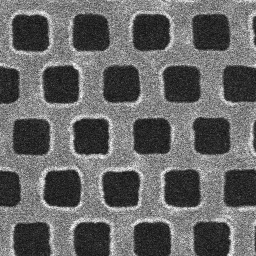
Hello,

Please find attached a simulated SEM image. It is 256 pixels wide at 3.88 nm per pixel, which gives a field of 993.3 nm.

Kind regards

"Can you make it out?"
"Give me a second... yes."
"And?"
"a regular array of holes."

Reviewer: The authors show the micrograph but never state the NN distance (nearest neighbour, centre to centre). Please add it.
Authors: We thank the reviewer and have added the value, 230 nm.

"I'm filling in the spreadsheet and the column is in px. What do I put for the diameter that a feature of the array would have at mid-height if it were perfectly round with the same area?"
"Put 40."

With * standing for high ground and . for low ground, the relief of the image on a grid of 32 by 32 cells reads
********************************
********************************
**....***....****....***....****
*.....***.....***....***.....***
**....***.....***....***.....***
**....***.....***....***.....***
********************************
********************************
.*****...****....****...****....
..***.....***....***.....***....
..***.....***.....***....***....
..***.....***.....***....***....
..****....***....****....***....
********************************
********************************
**....***....****....***.....***
**....***.....***....***.....***
**....***.....***....***.....***
**....***.....***....***.....***
***..***************************
********************************
.*****....***....****...****....
..****....***....****....***....
...***....***....****....***....
...**.....***....***.....***....
..****....***....****....***....
********************************
********************************
**....***.....***....***.....***
**....***.....***....***.....***
**....***.....***....***.....***
**....***.....***....***.....***